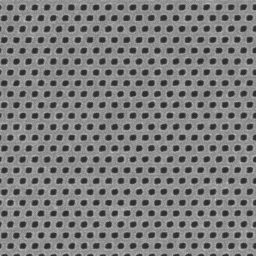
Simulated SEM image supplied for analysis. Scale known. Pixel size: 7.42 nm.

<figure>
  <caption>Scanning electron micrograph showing a regular array of holes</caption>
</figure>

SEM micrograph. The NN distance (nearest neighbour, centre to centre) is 88.7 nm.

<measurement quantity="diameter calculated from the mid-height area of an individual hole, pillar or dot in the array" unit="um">0.0529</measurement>